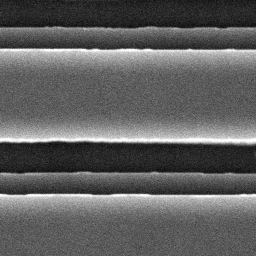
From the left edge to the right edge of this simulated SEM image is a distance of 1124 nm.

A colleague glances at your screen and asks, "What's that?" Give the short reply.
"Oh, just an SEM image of lines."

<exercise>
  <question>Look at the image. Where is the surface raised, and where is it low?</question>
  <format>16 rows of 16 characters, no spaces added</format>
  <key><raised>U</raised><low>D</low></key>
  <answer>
DDDDDDDDDDDDDDDD
DDDDDDDDDDDDDDDD
DDDDDDDDDDDDDDDD
UUUUUUUUUUUUUUUU
UUUUUUUUUUUUUUUU
UUUUUUUUUUUUUUUU
UUUUUUUUUUUUUUUU
UUUUUUUUUUUUUUUU
UUUUUUUUUUUUUUUU
DDDDDDDDDDDDDDDD
DDDDDDDDDDDDDDDD
DDDDDDDDDDDDDDDD
UUUUUUUUUUUUUUUU
UUUUUUUUUUUUUUUU
UUUUUUUUUUUUUUUU
UUUUUUUUUUUUUUUU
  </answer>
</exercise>